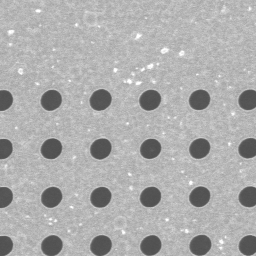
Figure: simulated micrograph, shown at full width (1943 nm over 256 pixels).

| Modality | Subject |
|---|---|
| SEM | a regular array of holes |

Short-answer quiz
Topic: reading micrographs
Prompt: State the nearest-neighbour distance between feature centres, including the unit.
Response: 368 nanometres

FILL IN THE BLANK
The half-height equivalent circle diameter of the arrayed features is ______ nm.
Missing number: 157